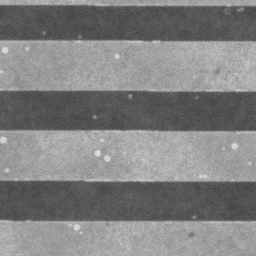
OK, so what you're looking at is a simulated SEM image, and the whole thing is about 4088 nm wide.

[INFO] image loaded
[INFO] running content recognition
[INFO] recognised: lines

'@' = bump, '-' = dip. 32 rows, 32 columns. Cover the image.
@@@@@@@@@@@@@@@@@@@@@@@@@@@@@@@@
--------------------------------
--------------------------------
--------------------------------
--------------------------------
@@@@@@@@@@@@@@@@@@@@@@@@@@@@@@@@
@@@@@@@@@@@@@@@@@@@@@@@@@@@@@@@@
@@@@@@@@@@@@@@@@@@@@@@@@@@@@@@@@
@@@@@@@@@@@@@@@@@@@@@@@@@@@@@@@@
@@@@@@@@@@@@@@@@@@@@@@@@@@@@@@@@
@@@@@@@@@@@@@@@@@@@@@@@@@@@@@@@@
--------------------------------
--------------------------------
--------------------------------
--------------------------------
--------------------------------
@@@@@@@@@@@@@@@@@@@@------------
@@@@@@@@@@@@@@@@@@@@@@@@@@@@@@@@
@@@@@@@@@@@@@@@@@@@@@@@@@@@@@@@@
@@@@@@@@@@@@@@@@@@@@@@@@@@@@@@@@
@@@@@@@@@@@@@@@@@@@@@@@@@@@@@@@@
@@@@@@@@@@@@@@@@@@@@@@@@@@@@@@@@
----------@@@@@@@@@@@@@@@@@@@@@@
--------------------------------
--------------------------------
--------------------------------
--------------------------------
--------------------------------
@@@@@@@@@@@@@@@@@@@@@@@@@@@@@@@@
@@@@@@@@@@@@@@@@@@@@@@@@@@@@@@@@
@@@@@@@@@@@@@@@@@@@@@@@@@@@@@@@@
@@@@@@@@@@@@@@@@@@@@@@@@@@@@@@@@